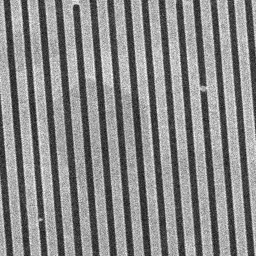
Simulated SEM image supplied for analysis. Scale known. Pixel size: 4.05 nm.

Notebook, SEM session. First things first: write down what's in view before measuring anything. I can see parallel lines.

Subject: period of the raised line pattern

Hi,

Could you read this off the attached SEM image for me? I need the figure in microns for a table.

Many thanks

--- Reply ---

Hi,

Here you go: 0.0695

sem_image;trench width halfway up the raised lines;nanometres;31.3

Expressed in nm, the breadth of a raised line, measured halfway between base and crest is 39.3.